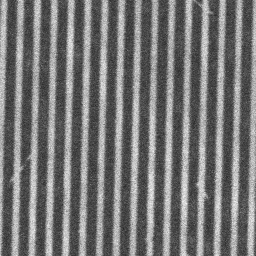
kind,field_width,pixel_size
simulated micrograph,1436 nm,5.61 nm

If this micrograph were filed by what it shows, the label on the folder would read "parallel lines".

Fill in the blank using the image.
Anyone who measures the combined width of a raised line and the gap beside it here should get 94.2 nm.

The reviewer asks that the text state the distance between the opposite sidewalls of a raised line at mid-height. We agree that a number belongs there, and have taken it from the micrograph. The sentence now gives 29.4 nanometers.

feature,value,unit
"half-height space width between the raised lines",63.7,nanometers